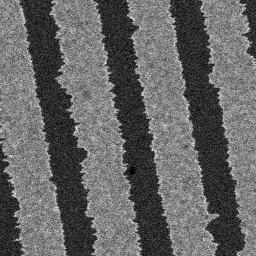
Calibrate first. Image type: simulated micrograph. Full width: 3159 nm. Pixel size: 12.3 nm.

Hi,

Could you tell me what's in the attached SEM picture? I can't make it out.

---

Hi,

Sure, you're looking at one or a few lines or trenches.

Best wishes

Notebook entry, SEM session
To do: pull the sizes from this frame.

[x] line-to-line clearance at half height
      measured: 386 nm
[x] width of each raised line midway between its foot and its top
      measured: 514 nanometers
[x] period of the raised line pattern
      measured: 900 nm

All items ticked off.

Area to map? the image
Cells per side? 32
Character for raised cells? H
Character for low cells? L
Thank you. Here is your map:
HHLLLLLHHHHHLLLLHHHHHLLLLHHHHHLL
HHHLLLHHHHHHLLLLHHHHHLLLLHHHHHLL
HHHLLLLHHHHHLLLLLHHHHHLLLLHHHHHL
HHHLLLLHHHHHHLLLLHHHHHLLLLHHHHHL
HHHLLLLHHHHHHLLLLHHHHHLLLLHHHHHL
HHHLLLLHHHHHHLLLLHHHHHLLLLHHHHHL
HHHLLLLLHHHHHLLLLHHHHHLLLLHHHHHL
HHHHLLLLHHHHHLLLLHHHHHLLLLHHHHHH
HHHHLLLLHHHHHLLLLHHHHHHLLLLHHHHH
HHHHLLLLHHHHHHLLLHHHHHHLLLHHHHHH
HHHHLLLLHHHHHHLLLLHHHHHLLLLHHHHH
HHHHLLLLHHHHHHLLLLHHHHHLLLLLHHHH
HHHHHLLLLHHHHHLLLLHHHHHLLLLHHHHH
HHHHHLLLLHHHHHLLLLHHHHHLLLLLHHHH
HHHHHLLLLHHHHHLLLLLHHHHHLLLLHHHH
HHHHHLLLLLHHHHHLLLLHHHHHLLLLHHHH
HHHHHLLLLHHHHHHLLLLHHHHHLLLLHHHH
HHHHHHLLLLHHHHHLLLLHHHHHLLLLLHHH
HHHHHHLLLLHHHHHLLLLHHHHHLLLLLHHH
LHHHHHLLLLLHHHHLLLLHHHHHHLLLLHHH
LHHHHHLLLLHHHHHLLLLLHHHHHLLLLHHH
LHHHHHLLLLHHHHHLLLLLHHHHHLLLLHHH
LHHHHHLLLLHHHHHHLLLLHHHHHLLLLHHH
LLHHHHHLLLLHHHHHLLLLHHHHHLLLLHHH
LLHHHHHLLLLHHHHHLLLLHHHHHLLLLLHH
LLHHHHHLLLLHHHHHHLLLHHHHHHLLLLHH
LLHHHHHLLLLHHHHHHLLLLHHHHHLLLLHH
LLHHHHHHLLLLHHHHHLLLLHHHHHLLLLHH
LLHHHHHHLLLLHHHHHLLLLHHHHHLLLLHH
LLHHHHHHLLLLHHHHHLLLLHHHHHLLLLLH
LLLHHHHHLLLLHHHHHLLLLLHHHHHLLLLH
LLLHHHHHLLLLHHHHHLLLLLHHHHHLLLHH